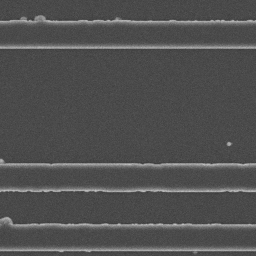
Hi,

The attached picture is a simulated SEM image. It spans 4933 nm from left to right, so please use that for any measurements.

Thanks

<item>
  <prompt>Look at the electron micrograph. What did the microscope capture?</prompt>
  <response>lines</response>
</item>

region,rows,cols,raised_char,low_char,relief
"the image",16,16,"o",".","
................
oooooooooooooooo
oooooooooooooooo
................
................
................
................
................
................
................
oooooooooooooooo
oooooooooooooooo
................
................
oooooooooooooooo
oooooooooooooooo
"